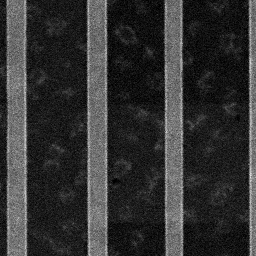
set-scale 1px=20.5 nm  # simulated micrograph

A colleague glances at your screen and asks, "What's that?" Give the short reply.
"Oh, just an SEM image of one or a few lines or trenches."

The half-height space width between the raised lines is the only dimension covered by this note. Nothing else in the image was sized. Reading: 1300 nm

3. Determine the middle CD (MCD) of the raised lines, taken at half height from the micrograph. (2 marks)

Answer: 354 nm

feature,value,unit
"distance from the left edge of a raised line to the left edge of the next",1610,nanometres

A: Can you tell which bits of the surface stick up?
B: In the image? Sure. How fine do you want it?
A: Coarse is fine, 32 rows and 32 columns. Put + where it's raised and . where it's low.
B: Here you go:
.++........++........++........+
.++........++........++........+
.++........++........++........+
.++........++........++........+
.++........++........++........+
.++........++........++........+
.++........++........++........+
.++........++........++........+
.++........++........++........+
.++........++........++........+
.++........++........++........+
.++........++........++........+
.++........++........++........+
.++........++........++........+
.++........++........++........+
.++........++........++........+
.++........++........++........+
.++........++........++........+
.++........++........++........+
.++........++........++........+
.++........++........++........+
.++........++........++........+
.++........++........++........+
.++........++........++........+
.++........++........++........+
.++........++........++........+
.++........++........++........+
.++........++........++........+
.++........++........++........+
.++........++........++........+
.++........++........++........+
.++........++........++........+